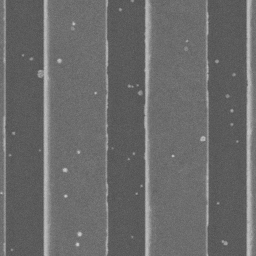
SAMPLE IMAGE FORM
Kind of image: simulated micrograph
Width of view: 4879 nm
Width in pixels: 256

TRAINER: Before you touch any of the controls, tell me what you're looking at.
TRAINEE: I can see lines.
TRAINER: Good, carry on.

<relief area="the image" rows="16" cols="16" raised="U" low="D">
DDDUUUUDDUUUUDDD
DDDUUUUDDUUUUDDD
DDDUUUUDDUUUUDDD
DDDUUUUDDUUUUDDD
DDDUUUUDDUUUUDDD
DDDUUUUDDUUUUDDD
DDDUUUUDDUUUUDDD
DDDUUUUDDUUUUDDD
DDDUUUUDDUUUUDDD
DDDUUUUDDUUUUDDD
DDDUUUUDDUUUUDDD
DDDUUUUDDUUUUDDD
DDDUUUUDDUUUUDDD
DDDUUUUDDUUUUDDD
DDDUUUUDDUUUUDDD
DDDUUUUDDUUUUDDD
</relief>